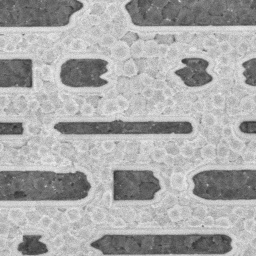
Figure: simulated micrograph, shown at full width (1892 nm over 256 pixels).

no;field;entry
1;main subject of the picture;parallel lines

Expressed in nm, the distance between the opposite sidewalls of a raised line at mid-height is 233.